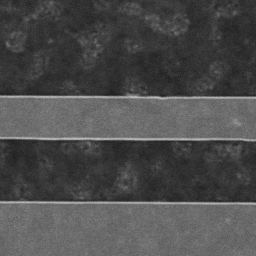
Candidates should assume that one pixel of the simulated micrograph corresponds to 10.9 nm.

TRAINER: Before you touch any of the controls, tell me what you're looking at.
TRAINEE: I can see one or a few lines or trenches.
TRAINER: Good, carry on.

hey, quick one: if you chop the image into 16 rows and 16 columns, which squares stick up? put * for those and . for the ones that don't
................
................
................
................
................
................
****************
****************
****************
................
................
................
................
****************
****************
****************